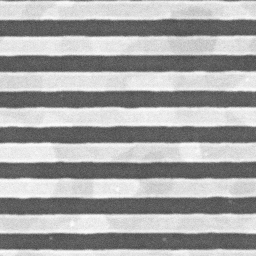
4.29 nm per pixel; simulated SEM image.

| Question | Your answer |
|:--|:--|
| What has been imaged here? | wiring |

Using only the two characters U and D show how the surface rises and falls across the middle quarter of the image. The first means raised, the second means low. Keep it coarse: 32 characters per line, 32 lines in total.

DDDDDDDDDDDDDDDDDDDDDDDDDDDDDDDD
DDDDDDDDDDDDDDDDDDDDDDDDDDDDDDDD
UUUUUUUUUUUUUUUUUUUUUUUUUUUUUUUU
UUUUUUUUUUUUUUUUUUUUUUUUUUUUUUUU
UUUUUUUUUUUUUUUUUUUUUUUUUUUUUUUU
UUUUUUUUUUUUUUUUUUUUUUUUUUUUUUUU
DDDDDDDDDDDDDDDDDDDDDDDDDDDDDDDD
DDDDDDDDDDDDDDDDDDDDDDDDDDDDDDDD
DDDDDDDDDDDDDDDDDDDDDDDDDDDDDDDD
DDDDDDDDDDDDDDDDDDDDDDDDDDDDDDDD
DDDDDDDDDDDDDDDDDDDDDDDDDDDDDDDD
UUUUUUUUUUUUUUUUUUUUUUUUUUUUUUUU
UUUUUUUUUUUUUUUUUUUUUUUUUUUUUUUU
UUUUUUUUUUUUUUUUUUUUUUUUUUUUUUUU
UUUUUUUUUUUUUUUUUUUUUUUUUUUUUUUU
DDDDDDDDDUUUDDDDDDDDDDDDDDDDDDDD
DDDDDDDDDDDDDDDDDDDDDDDDDDDDDDDD
DDDDDDDDDDDDDDDDDDDDDDDDDDDDDDDD
DDDDDDDDDDDDDDDDDDDDDDDDDDDDDDDD
DDDDDDDDDDDDDDDDDDDDDDDDDDDDDDDD
UUUUUUUUUUUUUUUUUUUUUUUUUUUUUUUU
UUUUUUUUUUUUUUUUUUUUUUUUUUUUUUUU
UUUUUUUUUUUUUUUUUUUUUUUUUUUUUUUU
UUUUUUUUUUUUUUUUUUUUUUUUUUUUUUUU
DDDDDDDDDDDDDDDDDDDDDDDDDDDDDDDD
DDDDDDDDDDDDDDDDDDDDDDDDDDDDDDDD
DDDDDDDDDDDDDDDDDDDDDDDDDDDDDDDD
DDDDDDDDDDDDDDDDDDDDDDDDDDDDDDDD
DDDDDDDDDDDDDDDDDDDDDDDDDDDDDDDD
UUUUUUUUUUUUUUUUUUUUUUUUUUUUUUUU
UUUUUUUUUUUUUUUUUUUUUUUUUUUUUUUU
UUUUUUUUUUUUUUUUUUUUUUUUUUUUUUUU